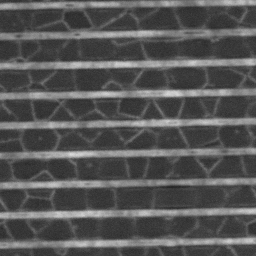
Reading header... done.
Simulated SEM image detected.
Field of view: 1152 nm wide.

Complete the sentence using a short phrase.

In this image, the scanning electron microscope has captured parallel lines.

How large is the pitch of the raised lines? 134 nm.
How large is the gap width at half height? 106 nanometers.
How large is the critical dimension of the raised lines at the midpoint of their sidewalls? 28.7 nanometers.